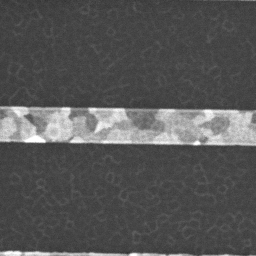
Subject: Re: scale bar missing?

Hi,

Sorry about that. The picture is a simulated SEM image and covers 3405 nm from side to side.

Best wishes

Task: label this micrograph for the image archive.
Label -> one or a few lines or trenches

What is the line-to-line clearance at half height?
1490 nm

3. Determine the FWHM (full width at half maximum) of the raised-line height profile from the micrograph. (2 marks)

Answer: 427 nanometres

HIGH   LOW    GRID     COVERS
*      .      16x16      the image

................
................
................
................
................
................
................
****************
****************
................
................
................
................
................
................
................